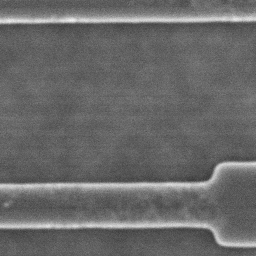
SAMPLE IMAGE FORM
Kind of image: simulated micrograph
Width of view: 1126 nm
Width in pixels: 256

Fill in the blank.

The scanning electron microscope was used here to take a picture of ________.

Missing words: wiring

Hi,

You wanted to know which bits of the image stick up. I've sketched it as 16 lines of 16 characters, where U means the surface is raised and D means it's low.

UUUUUUUUUUUUUUUU
DDDDDDDDDDDDDDDD
DDDDDDDDDDDDDDDD
DDDDDDDDDDDDDDDD
DDDDDDDDDDDDDDDD
DDDDDDDDDDDDDDDD
DDDDDDDDDDDDDDDD
DDDDDDDDDDDDDDDD
DDDDDDDDDDDDDDDD
DDDDDDDDDDDDDDDD
DDDDDDDDDDDDDDUU
DDDDDDDDUUUUUUUU
UUUUUUUUUUUUUUUU
UUUUUUUUUUUUUUUU
DDDDDDDDDDDDDUUU
DDDDDDDDDDDDDDDD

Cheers